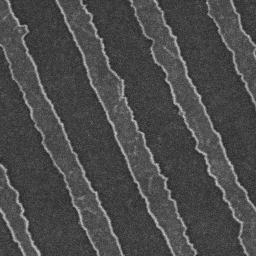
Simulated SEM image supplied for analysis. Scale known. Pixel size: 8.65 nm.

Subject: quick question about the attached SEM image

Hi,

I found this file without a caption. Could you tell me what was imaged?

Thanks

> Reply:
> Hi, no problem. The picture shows one or a few lines or trenches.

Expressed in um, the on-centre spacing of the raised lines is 0.593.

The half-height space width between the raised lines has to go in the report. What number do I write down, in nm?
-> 396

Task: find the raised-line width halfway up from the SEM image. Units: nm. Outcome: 194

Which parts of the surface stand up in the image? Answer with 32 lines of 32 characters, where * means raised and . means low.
*......***.......***......***...
*.......***......***......****..
**......***......****......***..
***......***......***......***..
***......***......****......***.
***.......***......***......****
.**.......***......***.......***
.***.......**......****......***
.***.......***......***.......**
..***......****......**.......**
..***......****......***.......*
...**.......***.......***......*
...***.......***......***.......
....***......***......****......
....***......****......***......
....****......***......***......
.....***......****......***.....
.....***.......***.......***....
......***......***.......***....
......****......***.......**....
.......***......***.......***...
*.......**......****......***...
*.......***......****......***..
**.......**......****.......**..
**.......***......***.......***.
**.......***......****.......**.
***.......***......***.......***
.**.......****.....****.......**
.**........***......***.......**
..**.......***.......**.......**
..**........***......***......**
...**.......***.......**.......*